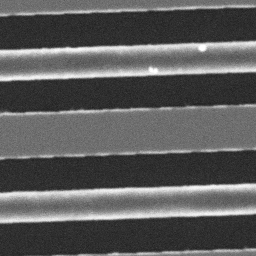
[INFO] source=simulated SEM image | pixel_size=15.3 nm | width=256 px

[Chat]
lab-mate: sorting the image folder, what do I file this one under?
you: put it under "lines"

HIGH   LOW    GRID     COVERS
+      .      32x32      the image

++++++++++++++++++++++++++++++++
+++++++++.......................
................................
................................
................................
...............................+
++++++++++++++++++++++++++++++++
++++++++++++++++++++++++++++++++
++++++++++++++++++++++++++++++++
++++++++++......................
................................
................................
................................
........................++++++++
++++++++++++++++++++++++++++++++
++++++++++++++++++++++++++++++++
++++++++++++++++++++++++++++++++
++++++++++++++++++++++++++++++++
++++++++++++++++++++++++++++++++
+++++++.........................
................................
................................
................................
........................++++++++
++++++++++++++++++++++++++++++++
++++++++++++++++++++++++++++++++
++++++++++++++++++++++++++++++++
++..............................
................................
................................
................................
........................++++++++